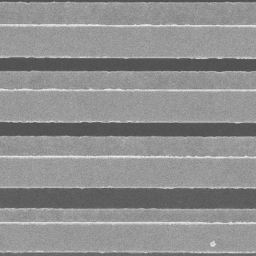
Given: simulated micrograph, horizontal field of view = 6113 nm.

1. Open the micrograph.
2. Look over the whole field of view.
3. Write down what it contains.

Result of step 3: lines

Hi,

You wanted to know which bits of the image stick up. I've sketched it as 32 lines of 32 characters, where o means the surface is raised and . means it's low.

oooooooooooooooooooooooooooooooo
oooooooooooooooooooooooooooooooo
oooooooooooooooooooooooooooooooo
oooooooooooooooooooooooooooooooo
oooooooooooooooooooooooooooooooo
oooooooooooooooooooooooooooooooo
oooooooooooooooooooooooooooooooo
................................
................................
oooooooooooooooooooooooooooooooo
oooooooooooooooooooooooooooooooo
oooooooooooooooooooooooooooooooo
oooooooooooooooooooooooooooooooo
oooooooooooooooooooooooooooooooo
oooooooooooooooooooooooooooooooo
................................
................................
oooooooooooooooooooooooooooooooo
oooooooooooooooooooooooooooooooo
oooooooooooooooooooooooooooooooo
oooooooooooooooooooooooooooooooo
oooooooooooooooooooooooooooooooo
oooooooooooooooooooooooooooooooo
...o....o.o.........oo..o.oo.ooo
................................
................................
oooooooooooooooooooooooooooooooo
oooooooooooooooooooooooooooooooo
oooooooooooooooooooooooooooooooo
oooooooooooooooooooooooooooooooo
oooooooooooooooooooooooooooooooo
............o.....o.....oooooooo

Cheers